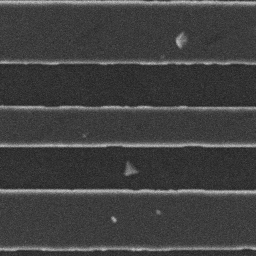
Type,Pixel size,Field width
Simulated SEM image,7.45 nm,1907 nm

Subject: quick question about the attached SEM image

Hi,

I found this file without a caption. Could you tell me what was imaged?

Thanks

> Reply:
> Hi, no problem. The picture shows lines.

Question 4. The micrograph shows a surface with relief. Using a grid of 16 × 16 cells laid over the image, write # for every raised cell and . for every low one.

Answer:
################
################
################
################
................
................
................
################
################
................
................
................
################
################
################
################